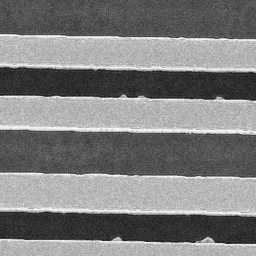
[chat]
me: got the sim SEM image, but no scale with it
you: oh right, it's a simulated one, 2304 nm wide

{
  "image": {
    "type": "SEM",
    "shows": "lines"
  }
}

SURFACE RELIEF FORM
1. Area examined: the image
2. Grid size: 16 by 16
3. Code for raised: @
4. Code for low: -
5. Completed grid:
----------------
----------------
@@@@@@@@@@@@@@@-
@@@@@@@@@@@@@@@@
----------------
----------------
@@@@@@@@@@@@@@@@
@@@@@@@@@@@@@@@@
----------------
----------------
----------------
@@@@@@@@@@@@@@@@
@@@@@@@@@@@@@@@@
----------------
----------------
@@@@@@@@@@@@@@@@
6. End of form